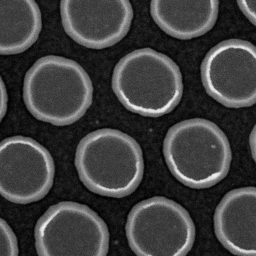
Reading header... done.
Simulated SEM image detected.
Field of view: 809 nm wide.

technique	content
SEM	raised bodies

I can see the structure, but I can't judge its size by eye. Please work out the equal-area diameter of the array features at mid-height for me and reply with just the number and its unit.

200 nm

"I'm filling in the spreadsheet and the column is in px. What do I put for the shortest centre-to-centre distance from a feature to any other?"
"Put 87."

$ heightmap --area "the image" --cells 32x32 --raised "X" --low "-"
XXXX----XXXXXXXX---XXXXXXXX---XX
XXXXX---XXXXXXXX---XXXXXXXX----X
XXXXX---XXXXXXXX----XXXXXXX-----
XXXXX----XXXXXXX-----XXXXX------
XXXX-----XXXXXX-----------------
XXXX-------XX---------------XXX-
------------------X--------XXXXX
------X---------XXXXX-----XXXXXX
----XXXXXX-----XXXXXXX----XXXXXX
----XXXXXXX---XXXXXXXX----XXXXXX
---XXXXXXXX---XXXXXXXX----XXXXXX
---XXXXXXXX----XXXXXXX----XXXXXX
X--XXXXXXXX----XXXXXXX------XXXX
----XXXXXXX-----XXXXX-----------
-----XXXXX----------------------
-----------------------XXX------
-------------X--------XXXXX-----
-XX--------XXXXX-----XXXXXXX----
XXXXX-----XXXXXXX----XXXXXXX----
XXXXXX----XXXXXXX----XXXXXXXX---
XXXXXX----XXXXXXXX---XXXXXXX----
XXXXXX----XXXXXXXX----XXXXXX----
XXXXXX-----XXXXXX------XXXX-----
XXXXXX------XXXXX---------------
-XXXX------------------------XXX
------------------XXXX------XXXX
------XXXXX------XXXXXX----XXXXX
-----XXXXXXX----XXXXXXXX---XXXXX
X----XXXXXXXX---XXXXXXXX---XXXXX
X----XXXXXXXX---XXXXXXXX----XXXX
XX---XXXXXXXX---XXXXXXXX----XXXX
XX---XXXXXXXX----XXXXXX------XXX